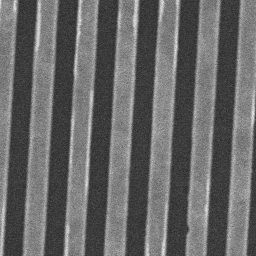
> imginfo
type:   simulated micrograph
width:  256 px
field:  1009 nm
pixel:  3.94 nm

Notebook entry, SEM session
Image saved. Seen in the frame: parallel lines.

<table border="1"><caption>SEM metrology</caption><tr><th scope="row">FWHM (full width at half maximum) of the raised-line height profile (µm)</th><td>0.0816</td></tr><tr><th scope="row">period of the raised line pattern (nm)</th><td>160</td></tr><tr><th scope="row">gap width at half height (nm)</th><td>78.1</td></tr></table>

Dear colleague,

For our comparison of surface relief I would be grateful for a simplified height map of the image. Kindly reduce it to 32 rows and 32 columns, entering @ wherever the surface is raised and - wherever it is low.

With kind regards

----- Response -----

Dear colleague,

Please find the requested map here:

@@---@@---@@---@@---@@---@@---@@
@@---@@---@@---@@---@@---@@---@@
@@---@@---@@---@@---@@---@@---@@
@@--@@@---@@---@@---@@---@@---@@
@@--@@@---@@---@@---@@---@@---@@
@@--@@@---@@---@@---@@---@@---@@
@@--@@@--@@@--@@@---@@---@@---@@
@@--@@@--@@@--@@@---@@---@@---@@
@@--@@@--@@@--@@@--@@@---@@---@@
@@--@@@--@@@--@@@--@@@--@@@---@@
@@--@@@--@@@--@@@--@@@--@@@---@@
@---@@@--@@@--@@@--@@@--@@@---@@
@---@@@--@@@--@@@--@@@--@@@--@@@
@---@@---@@@--@@@--@@@--@@@--@@@
@---@@---@@---@@@--@@@--@@@--@@@
@---@@---@@---@@---@@@--@@@--@@@
@---@@---@@---@@---@@@--@@@--@@@
@---@@---@@---@@---@@---@@@--@@@
@---@@---@@---@@---@@---@@---@@@
@---@@---@@---@@---@@---@@---@@-
@---@@---@@---@@---@@---@@---@@-
@--@@@---@@---@@---@@---@@---@@-
@--@@@---@@---@@---@@---@@---@@-
@--@@@---@@---@@---@@---@@---@@-
@--@@@--@@@--@@@---@@---@@---@@-
@--@@@--@@@--@@@---@@---@@---@@-
@--@@@--@@@--@@@--@@@---@@---@@-
@--@@@--@@@--@@@--@@@--@@@---@@-
@--@@@--@@@--@@@--@@@---@@---@@-
---@@@--@@@--@@@--@@@--@@@--@@@-
---@@---@@@--@@@--@@@--@@@--@@@-
---@@---@@@--@@@--@@@--@@@--@@@-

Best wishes